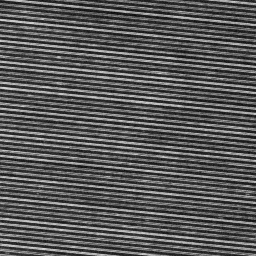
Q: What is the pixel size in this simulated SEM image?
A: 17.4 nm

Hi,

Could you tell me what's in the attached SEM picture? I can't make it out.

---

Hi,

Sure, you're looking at parallel lines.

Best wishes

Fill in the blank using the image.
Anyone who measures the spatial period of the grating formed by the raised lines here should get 90.4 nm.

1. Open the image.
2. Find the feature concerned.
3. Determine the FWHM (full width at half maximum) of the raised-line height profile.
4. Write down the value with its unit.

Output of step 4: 1.49 pixels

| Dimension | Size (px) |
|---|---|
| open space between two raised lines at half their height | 3.85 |